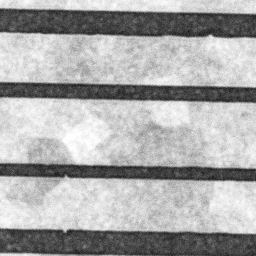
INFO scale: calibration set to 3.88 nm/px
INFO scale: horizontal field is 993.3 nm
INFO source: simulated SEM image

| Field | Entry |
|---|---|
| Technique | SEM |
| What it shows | one or a few lines or trenches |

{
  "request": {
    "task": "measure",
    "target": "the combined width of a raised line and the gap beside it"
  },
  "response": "282 nanometres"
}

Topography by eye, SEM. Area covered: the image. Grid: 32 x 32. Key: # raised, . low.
################################
........................########
................................
................................
###########.#...................
################################
################################
################################
################################
################################
.....................###########
................................
#######.........................
################################
################################
################################
################################
################################
################################
################################
.........#######################
................................
###############.................
################################
################################
################################
################################
################################
.###############################
................................
................................
................................